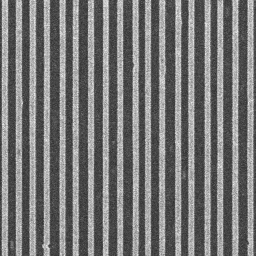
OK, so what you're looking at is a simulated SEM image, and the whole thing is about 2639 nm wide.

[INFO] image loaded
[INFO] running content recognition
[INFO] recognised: parallel lines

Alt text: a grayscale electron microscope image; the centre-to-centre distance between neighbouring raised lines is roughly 0.149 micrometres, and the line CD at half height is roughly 56.7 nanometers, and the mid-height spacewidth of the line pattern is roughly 0.0954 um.